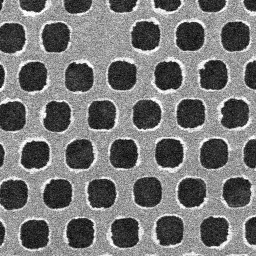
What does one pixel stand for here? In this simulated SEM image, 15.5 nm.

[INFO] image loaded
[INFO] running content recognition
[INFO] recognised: a regular array of holes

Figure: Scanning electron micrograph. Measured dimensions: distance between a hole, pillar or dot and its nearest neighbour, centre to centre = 44.2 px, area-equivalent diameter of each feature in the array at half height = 0.481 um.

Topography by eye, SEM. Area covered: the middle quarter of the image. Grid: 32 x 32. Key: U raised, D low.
UDDDDDUUUUUDDDDDDDUUUUUDDDDDDUUU
DDDDDDDUUUUDDDDDDDUUUUUDDDDDDUUU
DDDDDDDDUUUDDDDDDDUUUUDDDDDDDDUU
DDDDDDDDUUUDDDDDDDUUUUUDDDDDDDUU
DDDDDDDDUUUDDDDDDDUUUUUDDDDDDDUU
DDDDDDDUUUUDDDDDDDUUUUUDDDDDDUUU
UDDDDDUUUUUUDDDDUUUUUUUUDDUDUUUU
UUUUUUUUUUUUUUUUUUUUUUUUUUUUUUUU
UUUUUUUUUUUUUUUUUUUUUUUUUUUUUUUU
DUUUUUUDDDDDUUUUUUDDDDDUUUUUUDDD
DUUUUUDDDDDDDUUUUDDDDDDDUUUUDDDD
DDUUUUDDDDDDDUUUUDDDDDDDUUUUDDDD
DDUUUUDDDDDDDUUUUDDDDDDDUUUUDDDD
DDUUUUDDDDDDDUUUUDDDDDDDUUUUDDDD
DDUUUUDDDDDDDUUUUDDDDDDDUUUUDDDD
DUUUUUDDDDDDDUUUUUDDDDDUUUUUUDDD
DUUUUUUUUUUUUUUUUUUUUUUUUUUUUUUU
UUUUUUUUUUUUUUUUUUUUUUUUUUUUUUUU
UUUUUUUUUUUUUUUUUUUUUUUUUDDUUUUU
UUDDDDDUUUUUDDDDDDUUUUUUDDDDDUUU
UDDDDDDUUUUUDDDDDDUUUUUDDDDDDDUU
DDDDDDDUUUUDDDDDDDDUUUUDDDDDDDUU
DDDDDDDUUUUDDDDDDDDUUUUDDDDDDDUU
DDDDDDDDUUUDDDDDDDDUUUUDDDDDDDUU
DDDDDDDUUUUDDDDDDDUUUUUDDDDDDDUU
UDDDDDUUUUUUDDDDDDUUUUUUDDDDDUUU
UUUUUUUUUUUUUUUUUUUUUUUUUUUUUUUU
UUUUUUUUUUUUUUUUUUUUUUUUUUUUUUUU
UUUUUUUUUUUUUUUUUUUDDDDUUUUUUUDD
DUUUUUDDDDDDUUUUUUDDDDDDUUUUUDDD
DDUUUUDDDDDDDUUUUDDDDDDDDUUUUDDD
DDUUUUDDDDDDDUUUUDDDDDDDDUUUDDDD